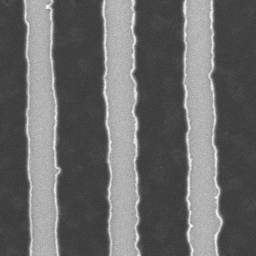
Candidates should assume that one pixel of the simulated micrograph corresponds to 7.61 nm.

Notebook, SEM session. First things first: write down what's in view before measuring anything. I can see one or a few lines or trenches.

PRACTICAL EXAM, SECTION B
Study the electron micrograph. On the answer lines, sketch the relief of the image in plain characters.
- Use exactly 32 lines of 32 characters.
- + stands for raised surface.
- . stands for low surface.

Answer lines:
+++...+++++++....++++++...++++++
+++...+++++++....++++++...++++++
+++...+++++++....++++++...++++++
++++..+++++++....++++++...++++++
++++..+++++++....++++++....+++++
+++...+++++++....++++++....+++++
+++...+++++++....++++++....+++++
++++..+++++++....++++++....+++++
++++..+++++++....++++++...++++++
++++...++++++...+++++++...++++++
++++...++++++....++++++...++++++
++++...++++++....++++++....+++++
++++...++++++....++++++....+++++
++++...++++++....++++++....+++++
++++...++++++....++++++....+++++
+++....++++++....+++++++...+++++
+++....+++++++...+++++++...+++++
++++...+++++++...++++++....+++++
++++...+++++++...+++++++...+++++
++++...+++++++...+++++++...+++++
++++...+++++++...+++++++...+++++
++++...+++++++...+++++++...+++++
++++...+++++++...+++++++...+++++
++++...+++++++...+++++++...+++++
++++...+++++++...+++++++...+++++
++++...+++++++...+++++++...+++++
++++...+++++++...+++++++...+++++
++++...+++++++...+++++++....++++
++++...+++++++...+++++++...+++++
++++...+++++++...+++++++...+++++
++++...+++++++...+++++++...+++++
++++...+++++++...+++++++...+++++